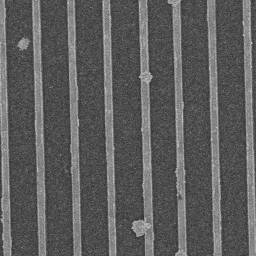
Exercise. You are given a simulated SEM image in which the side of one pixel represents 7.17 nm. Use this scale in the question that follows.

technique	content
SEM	parallel lines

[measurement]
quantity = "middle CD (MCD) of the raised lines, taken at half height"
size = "0.0538 um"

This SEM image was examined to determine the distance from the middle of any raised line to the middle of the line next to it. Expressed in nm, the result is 251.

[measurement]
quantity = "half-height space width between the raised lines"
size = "202 nanometres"